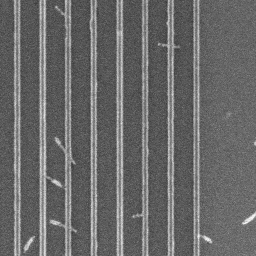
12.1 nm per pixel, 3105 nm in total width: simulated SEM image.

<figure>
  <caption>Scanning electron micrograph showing parallel lines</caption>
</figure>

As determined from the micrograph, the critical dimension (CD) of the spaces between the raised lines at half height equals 255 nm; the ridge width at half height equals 57.6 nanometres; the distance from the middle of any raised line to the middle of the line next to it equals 310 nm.